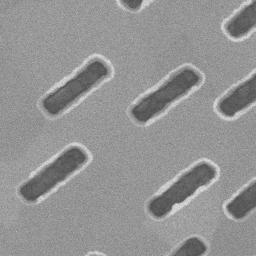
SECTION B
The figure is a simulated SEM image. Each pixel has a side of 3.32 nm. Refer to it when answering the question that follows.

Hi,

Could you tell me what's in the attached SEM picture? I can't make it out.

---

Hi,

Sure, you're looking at holes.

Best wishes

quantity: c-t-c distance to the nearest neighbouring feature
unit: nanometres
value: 298